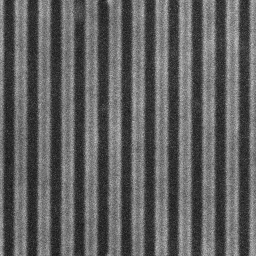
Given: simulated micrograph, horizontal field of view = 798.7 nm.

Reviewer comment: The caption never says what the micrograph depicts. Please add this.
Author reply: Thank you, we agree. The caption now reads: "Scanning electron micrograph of parallel lines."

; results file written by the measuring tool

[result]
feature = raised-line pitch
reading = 73.2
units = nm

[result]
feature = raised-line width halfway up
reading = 33.1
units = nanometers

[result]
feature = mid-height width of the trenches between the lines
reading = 41.3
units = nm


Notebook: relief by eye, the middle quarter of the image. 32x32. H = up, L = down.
HHLLLLHHLLLLHHLLLHHHLLLHHHLLLHHL
HHLLLLHHLLLLHHLLLHHHLLLHHHLLLHHL
HHLLLLHHLLLLHHLLLHHHLLLHHHLLLHHL
HHLLLLHHLLLLHHLLLHHHLLLHHHLLLHHL
HHLLLLHHLLLLHHLLLHHHLLLHHHLLLHHL
HHLLLLHHLLLLHHLLLHHHLLLHHHLLLHHL
HHLLLLHHLLLLHHLLLHHHLLLHHHLLLHHL
HHLLLLHHLLLLHHLLLHHHLLLHHHLLLHHL
HHLLLLHHLLLLHHLLLHHHLLLHHHLLLHHL
HHLLLLHHLLLLHHLLLHHHLLLHHHLLLHHL
HHLLLLHHLLLLHHLLLHHHLLLHHHLLLHHL
HHLLLLHHLLLLHHLLLHHHLLLHHHLLLHHL
HHLLLLHHLLLLHHLLLHHHLLLHHHLLLHHL
HHLLLLHHLLLLHHLLLHHHLLLHHHLLLHHL
HHLLLLHHLLLLHHLLLHHHLLLHHHLLLHHL
HHLLLLHHLLLLHHLLLHHHLLLHHHLLLHHL
HHLLLLHHLLLLHHLLLHHHLLLHHHLLLHHL
HHLLLLHHLLLLHHLLLHHHLLLHHHLLLHHL
HHLLLLHHLLLLHHLLLHHHLLLHHHLLLHHL
HHLLLLHHLLLLHHLLLHHHLLLHHHLLLHHL
HHLLLLHHLLLLHHLLLHHHLLLHHHLLLHHL
HHLLLLHHLLLLHHLLLHHHLLLHHHLLLHHL
HHLLLLHHLLLLHHLLLHHHLLLHHHLLLHHL
HHLLLLHHLLLLHHLLLHHHLLLHHHLLLHHL
HHLLLLHHLLLLHHLLLHHHLLLHHHLLLHHL
HHLLLLHHLLLLHHLLLHHHLLLHHHLLLHHL
HHLLLLHHLLLHHHLLLHHHLLLHHHLLLHHL
HHLLLLHHLLLHHHLLLHHHLLLHHHLLLHHL
HHLLLLHHLLLHHHLLLHHHLLLHHHLLLHHL
HHLLLLHHLLLHHHLLLHHHLLLHHHLLLHHL
HHLLLLHHLLLHHHLLLHHHLLLHHHLLLHHL
HHLLLLHHLLLHHHLLLHHHLLLHHHLLLHHL